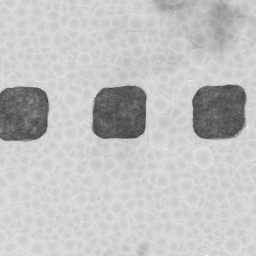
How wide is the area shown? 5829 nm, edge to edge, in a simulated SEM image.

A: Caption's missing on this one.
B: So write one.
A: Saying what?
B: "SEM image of holes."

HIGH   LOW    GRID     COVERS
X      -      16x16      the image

XXXXXXXXXXXXXXXX
XXXXXXXXXXXXXXXX
XXXXXXXXXXXXXXXX
XXXXXXXXXXXXXXXX
XXXXXXXXXXXXXXXX
X-XXXXX--XXXX--X
---XXX---XXX---X
---XXX---XXX---X
---XXX---XXXX--X
XXXXXXXXXXXXXXXX
XXXXXXXXXXXXXXXX
XXXXXXXXXXXXXXXX
XXXXXXXXXXXXXXXX
XXXXXXXXXXXXXXXX
XXXXXXXXXXXXXXXX
XXXXXXXXXXXXXXXX